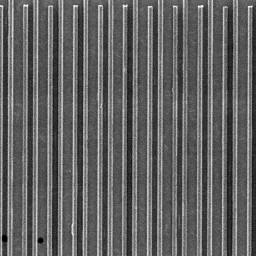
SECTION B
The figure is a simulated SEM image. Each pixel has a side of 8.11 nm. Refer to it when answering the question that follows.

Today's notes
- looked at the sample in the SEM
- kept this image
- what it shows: parallel lines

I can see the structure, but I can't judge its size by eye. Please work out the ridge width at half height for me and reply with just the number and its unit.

34.5 nm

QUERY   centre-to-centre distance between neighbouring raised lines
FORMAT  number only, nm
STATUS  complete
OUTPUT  102